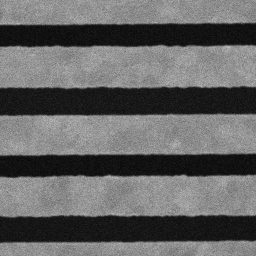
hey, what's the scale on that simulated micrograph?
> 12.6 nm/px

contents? lines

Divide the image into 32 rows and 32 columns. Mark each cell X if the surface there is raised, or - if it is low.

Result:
XXXXXXXXXXXXXXXXXXXXXXXXXXXXXXXX
XXXXXXXXXXXXXXXXXXXXXXXXXXXXXXXX
XXXXXXXXXXXXXXXXXXXXXXXXXXXXXXXX
--------------------------------
--------------------------------
--------------------------------
XXXXXXXXXXXXXXXXXXXXXXXXXXXXXXXX
XXXXXXXXXXXXXXXXXXXXXXXXXXXXXXXX
XXXXXXXXXXXXXXXXXXXXXXXXXXXXXXXX
XXXXXXXXXXXXXXXXXXXXXXXXXXXXXXXX
XXXXXXXXXXXXXXXXXXXXXXXXXXXXXXXX
--------------------------------
--------------------------------
--------------------------------
XXXXXXXXXXXXXXXXXXXXXXXXXXXXXXXX
XXXXXXXXXXXXXXXXXXXXXXXXXXXXXXXX
XXXXXXXXXXXXXXXXXXXXXXXXXXXXXXXX
XXXXXXXXXXXXXXXXXXXXXXXXXXXXXXXX
XXXXXXXXXXXXXXXXXXXXXXXXXXXXXXXX
--------------------------------
--------------------------------
--------------------------------
XXXXXXXXXXXXXXXXXXXXXXXXXXXXXXXX
XXXXXXXXXXXXXXXXXXXXXXXXXXXXXXXX
XXXXXXXXXXXXXXXXXXXXXXXXXXXXXXXX
XXXXXXXXXXXXXXXXXXXXXXXXXXXXXXXX
XXXXXXXXXXXXXXXXXXXXXXXXXXXXXXXX
--------------------------------
--------------------------------
--------------------------------
XXXXXXXXXXXXXXXXXXXXXXXXXXXXXXXX
XXXXXXXXXXXXXXXXXXXXXXXXXXXXXXXX